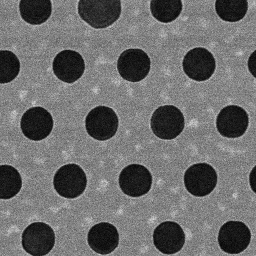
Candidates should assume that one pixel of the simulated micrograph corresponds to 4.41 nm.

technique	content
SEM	a regular array of holes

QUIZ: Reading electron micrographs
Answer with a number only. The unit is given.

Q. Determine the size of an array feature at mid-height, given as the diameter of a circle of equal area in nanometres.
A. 149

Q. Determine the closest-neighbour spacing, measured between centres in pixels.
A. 65.1